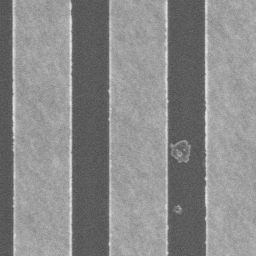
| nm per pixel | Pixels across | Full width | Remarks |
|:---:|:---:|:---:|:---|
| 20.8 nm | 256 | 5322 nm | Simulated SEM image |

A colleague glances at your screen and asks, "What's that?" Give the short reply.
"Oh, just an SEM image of lines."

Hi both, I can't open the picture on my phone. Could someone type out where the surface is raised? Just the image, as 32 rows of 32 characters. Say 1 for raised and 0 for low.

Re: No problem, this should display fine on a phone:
00111111100000111111100000111111
00111111100000111111100000111111
00111111100000111111100000111111
00111111100000111111100000111111
00111111100000111111100000111111
00111111100000111111100000111111
00111111100000111111100000111111
00111111100000111111100000111111
00111111100000111111100000111111
00111111100000111111100000111111
00111111100000111111100000111111
00111111100000111111100000111111
00111111100000111111100000111111
00111111100000111111100000111111
00111111100000111111100000111111
00111111100000111111100000111111
00111111100000111111100000111111
00111111100000111111100000111111
00111111100000111111100000111111
00111111100000111111100000111111
00111111100000111111100000111111
00111111100000111111100000111111
00111111100000111111100000111111
00111111100000111111100000111111
00111111100000111111100000111111
00111111100000111111100000111111
00111111100000111111100000111111
00111111100000111111100000111111
00111111100000111111100000111111
00111111100000111111100000111111
00111111100000111111100000111111
00111111100000111111100000111111